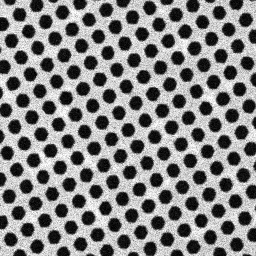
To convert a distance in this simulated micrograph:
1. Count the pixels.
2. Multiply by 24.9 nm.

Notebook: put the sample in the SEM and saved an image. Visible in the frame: a regular array of holes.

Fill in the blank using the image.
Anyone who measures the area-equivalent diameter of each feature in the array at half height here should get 0.356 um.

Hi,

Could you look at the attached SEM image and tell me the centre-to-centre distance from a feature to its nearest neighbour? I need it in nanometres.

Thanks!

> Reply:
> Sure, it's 475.